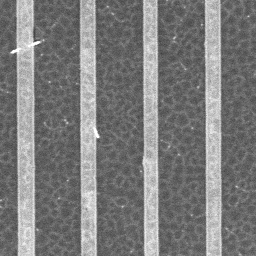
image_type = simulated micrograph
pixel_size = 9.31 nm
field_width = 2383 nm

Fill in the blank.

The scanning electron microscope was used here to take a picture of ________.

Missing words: parallel lines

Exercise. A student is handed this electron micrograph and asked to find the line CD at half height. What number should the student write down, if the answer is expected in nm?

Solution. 127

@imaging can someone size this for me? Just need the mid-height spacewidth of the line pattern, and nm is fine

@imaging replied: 455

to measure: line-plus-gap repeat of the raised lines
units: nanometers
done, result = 582